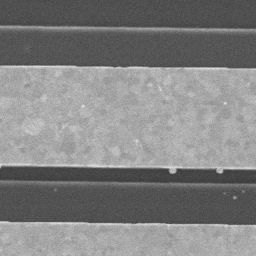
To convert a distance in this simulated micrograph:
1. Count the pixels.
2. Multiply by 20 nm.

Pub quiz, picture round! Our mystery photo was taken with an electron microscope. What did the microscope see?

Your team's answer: lines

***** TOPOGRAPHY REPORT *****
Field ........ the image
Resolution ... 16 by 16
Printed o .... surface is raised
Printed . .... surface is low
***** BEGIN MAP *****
................
................
................
................
oooooooooooooooo
oooooooooooooooo
oooooooooooooooo
oooooooooooooooo
oooooooooooooooo
oooooooooooooooo
..............oo
................
................
................
oooooooooooooooo
oooooooooooooooo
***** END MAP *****